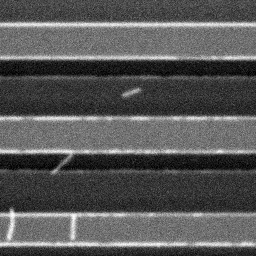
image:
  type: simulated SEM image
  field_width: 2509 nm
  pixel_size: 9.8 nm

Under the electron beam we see lines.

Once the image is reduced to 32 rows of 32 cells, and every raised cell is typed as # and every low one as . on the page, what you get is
................................
................................
................................
################################
################################
################################
################################
................................
................................
................................
................................
................................
................................
................................
................................
################################
################################
################################
################################
................................
................................
................................
................................
................................
................................
................................
................................
################################
################################
################################
################################
................................